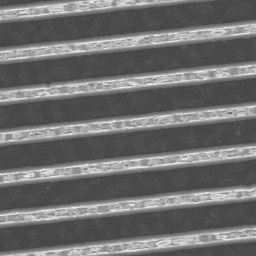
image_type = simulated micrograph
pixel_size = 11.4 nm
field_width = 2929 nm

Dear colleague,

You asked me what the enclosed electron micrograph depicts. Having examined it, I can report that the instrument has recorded parallel lines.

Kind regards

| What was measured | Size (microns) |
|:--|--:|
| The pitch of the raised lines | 0.465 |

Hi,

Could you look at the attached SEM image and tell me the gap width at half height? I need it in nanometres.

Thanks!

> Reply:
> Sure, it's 318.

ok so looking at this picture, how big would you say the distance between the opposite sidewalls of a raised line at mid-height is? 145 nm